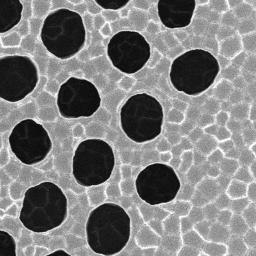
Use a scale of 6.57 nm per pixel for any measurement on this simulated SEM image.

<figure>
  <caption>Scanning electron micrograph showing a regular array of holes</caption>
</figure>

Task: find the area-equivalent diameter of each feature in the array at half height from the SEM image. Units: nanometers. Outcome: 297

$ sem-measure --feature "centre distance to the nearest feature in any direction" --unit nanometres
439